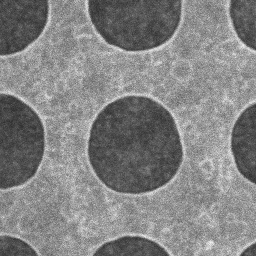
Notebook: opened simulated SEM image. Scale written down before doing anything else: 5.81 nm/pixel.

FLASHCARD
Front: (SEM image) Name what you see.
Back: holes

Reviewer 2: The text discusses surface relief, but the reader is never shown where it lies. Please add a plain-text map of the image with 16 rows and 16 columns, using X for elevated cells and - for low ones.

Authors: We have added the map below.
---XXX-----XXX--
---XXX-----XXX--
--XXXXX----XXXX-
XXXXXXXXXXXXXXXX
XXXXXXXXXXXXXXXX
XXXXXXXXXXXXXXXX
--XXXXX---XXXXXX
---XXX-----XXXX-
---XXX-----XXX--
---XX------XXX--
--XXXX-----XXXX-
-XXXXXX---XXXXXX
XXXXXXXXXXXXXXXX
XXXXXXXXXXXXXXXX
XXXXXXXXXXXXXXXX
--XXXX----XXXXX-